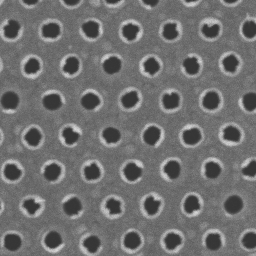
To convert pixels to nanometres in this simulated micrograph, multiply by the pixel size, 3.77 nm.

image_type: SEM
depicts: a regular array of holes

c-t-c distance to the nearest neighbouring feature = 0.148 um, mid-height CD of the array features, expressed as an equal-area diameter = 0.0602 micrometres